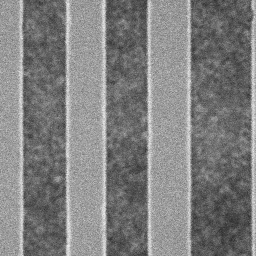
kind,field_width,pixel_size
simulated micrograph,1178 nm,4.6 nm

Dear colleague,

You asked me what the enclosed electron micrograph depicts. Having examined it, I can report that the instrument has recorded one or a few lines or trenches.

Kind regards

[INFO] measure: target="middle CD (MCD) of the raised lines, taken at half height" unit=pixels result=40.7